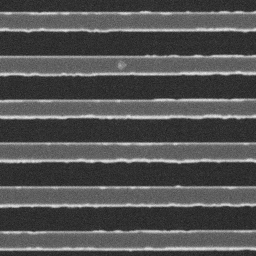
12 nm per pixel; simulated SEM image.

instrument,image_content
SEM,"lines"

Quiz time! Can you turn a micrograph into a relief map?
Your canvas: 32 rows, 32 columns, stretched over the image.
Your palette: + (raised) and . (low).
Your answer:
................................
.................++....+...+++++
++++++++++++++++++++++++++++++++
++++++++++++++++++++++++++++++++
................................
................................
................................
++++++++++++++++++++++++++++++++
++++++++++++++++++++++++++++++++
................................
................................
................................
...................+++++++++++++
++++++++++++++++++++++++++++++++
++++++++++++++++++++++++++++++++
................................
................................
................................
++++++++++++++++++++++++++++++++
++++++++++++++++++++++++++++++++
................................
................................
................................
++++++++++++++++++++++++++++++++
++++++++++++++++++++++++++++++++
++++++++++++++++++++++++++++++++
................................
................................
................................
++++++++++++++++++++++++++++++++
++++++++++++++++++++++++++++++++
................................